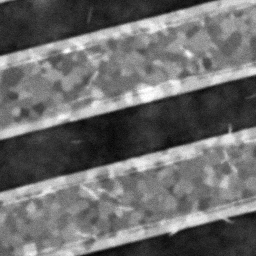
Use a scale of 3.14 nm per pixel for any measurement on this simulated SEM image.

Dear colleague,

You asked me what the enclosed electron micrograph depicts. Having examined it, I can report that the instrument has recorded one or a few lines or trenches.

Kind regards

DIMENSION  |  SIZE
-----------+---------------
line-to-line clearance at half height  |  59.4 px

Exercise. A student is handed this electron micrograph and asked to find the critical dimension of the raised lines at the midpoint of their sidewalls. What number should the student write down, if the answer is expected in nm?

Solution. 227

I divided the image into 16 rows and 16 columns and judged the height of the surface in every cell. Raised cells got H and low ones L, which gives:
LLLLLLLLLLLLLHHH
LLLLLLLLLHHHHHHH
LLLLLHHHHHHHHHHH
LHHHHHHHHHHHHHHH
HHHHHHHHHHHHHHHL
HHHHHHHHHHHHLLLL
HHHHHHHHLLLLLLLL
HHHHLLLLLLLLLLLL
LLLLLLLLLLLLLLLH
LLLLLLLLLLLHHHHH
LLLLLLLHHHHHHHHH
LLLHHHHHHHHHHHHH
HHHHHHHHHHHHHHHH
HHHHHHHHHHHHHHLL
HHHHHHHHHLLLLLLL
HHHHHHLLLLLLLLLL